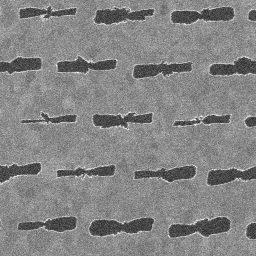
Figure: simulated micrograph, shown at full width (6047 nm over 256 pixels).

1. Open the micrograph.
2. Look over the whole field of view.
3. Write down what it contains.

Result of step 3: a regular array of holes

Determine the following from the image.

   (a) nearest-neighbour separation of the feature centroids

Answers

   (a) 1.5 microns